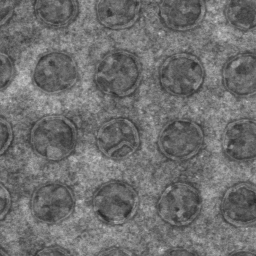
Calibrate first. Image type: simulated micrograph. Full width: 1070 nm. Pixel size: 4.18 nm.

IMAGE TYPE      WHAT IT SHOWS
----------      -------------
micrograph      a regular array of raised bodies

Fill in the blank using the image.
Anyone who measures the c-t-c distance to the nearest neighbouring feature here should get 265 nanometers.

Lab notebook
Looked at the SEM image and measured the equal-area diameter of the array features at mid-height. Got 174 nm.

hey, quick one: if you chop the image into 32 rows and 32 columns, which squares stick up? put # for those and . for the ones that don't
##...#####..#####...#####....###
#....#####..#####...######..####
#....####....####....####....###
......................##......##
................................
................................
...............#................
#....####....####....####....###
##..#####...######..#####...####
#...######..######..#####...####
#....####...#####...#####...####
......#......###.....###.....###
................................
................................
................................
#....####....###.....###.....###
#...#####...#####...#####...####
#...#####...#####...#####...####
#...#####....##.....#####...####
.....###.............###.....###
................................
................................
................................
.....###.....###.....###.....###
#...#####...#####...#####...####
#...#####...#####...#####...####
#...#####...#####...#####...####
.....###.....###.....###....####
................................
................................
................................
.....###.....###.....###.....##.